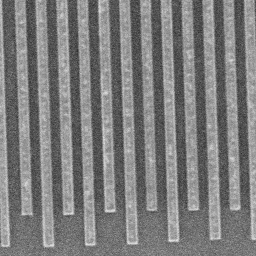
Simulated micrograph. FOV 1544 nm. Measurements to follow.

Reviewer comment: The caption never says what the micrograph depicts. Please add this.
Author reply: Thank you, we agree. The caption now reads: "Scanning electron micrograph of parallel lines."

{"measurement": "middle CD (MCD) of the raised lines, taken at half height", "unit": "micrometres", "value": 0.058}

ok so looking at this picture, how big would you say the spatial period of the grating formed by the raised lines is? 126 nanometres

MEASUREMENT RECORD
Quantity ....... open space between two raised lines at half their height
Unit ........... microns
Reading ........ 0.0701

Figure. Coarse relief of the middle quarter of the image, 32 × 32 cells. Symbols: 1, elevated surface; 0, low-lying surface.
10001100011000011000110001100011
10001100011100011000110001100011
10001100011100011000110001100011
10001100011100011000110001100011
10001100011100011000110001100011
10001100011100011000110001100011
10001100011100011000110001100011
10001100011100011000110001100011
10001100001100011000110001100011
10001100001100011000110001100011
10001100001100011000110001100001
10000100001100011000110001100001
10000110001100011000110001100001
10000110001100011000110000100001
10000110001100011000110000110001
10000110001100011000110000110001
11000110001100011000110000110001
11000110001100011000110000110001
11000110001100011000111000110001
11000110001100011000111000110001
11000110001100011000111000110001
11000110001100011000111000110001
11000110001100011000111000110001
11000110001100011000111000110001
11000110001100011000011000110001
11000110001100011000011000110001
11000110001100011000011000110001
11000110001100011100011000110001
11000110001100001100011000110001
11000110001100001100011000110001
11000110001100001100011000110001
11000110001100001100011000110001